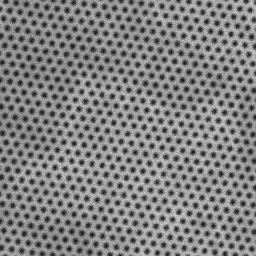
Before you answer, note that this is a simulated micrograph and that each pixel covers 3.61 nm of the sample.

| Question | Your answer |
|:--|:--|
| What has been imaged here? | a regular array of holes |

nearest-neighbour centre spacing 9.92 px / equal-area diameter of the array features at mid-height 22.3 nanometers